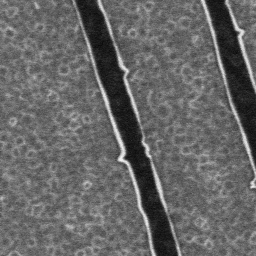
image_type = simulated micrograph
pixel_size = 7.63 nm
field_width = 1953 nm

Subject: one or a few lines or trenches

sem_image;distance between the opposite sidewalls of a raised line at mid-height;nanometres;196